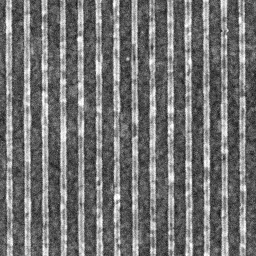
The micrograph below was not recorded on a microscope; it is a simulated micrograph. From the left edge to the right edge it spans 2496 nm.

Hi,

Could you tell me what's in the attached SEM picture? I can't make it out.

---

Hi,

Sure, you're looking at parallel lines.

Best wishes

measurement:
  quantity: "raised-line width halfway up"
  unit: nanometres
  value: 45.1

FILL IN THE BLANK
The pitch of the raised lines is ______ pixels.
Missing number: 17.9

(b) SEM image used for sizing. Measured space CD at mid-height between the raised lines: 0.127 µm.